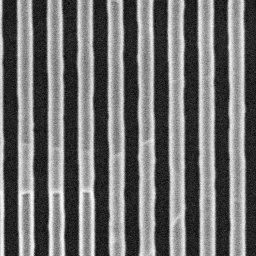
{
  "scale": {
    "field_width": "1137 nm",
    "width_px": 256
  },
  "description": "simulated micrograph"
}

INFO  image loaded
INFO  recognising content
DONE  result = wiring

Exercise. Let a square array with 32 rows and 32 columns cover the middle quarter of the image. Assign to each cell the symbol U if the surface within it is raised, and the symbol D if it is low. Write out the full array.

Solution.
DDDDUUUDDDDUUUUDDDDUUUDDDDUUUUDD
DDDDUUUDDDDUUUUDDDDUUUDDDDUUUUDD
DDDDUUUDDDDUUUUDDDDUUUDDDDUUUUDD
DDDDUUUDDDDUUUUDDDDUUUDDDDUUUUDD
DDDDUUUDDDDUUUUDDDDUUUDDDDUUUUDD
DDDDUUUDDDDUUUUDDDDUUUDDDDUUUUDD
DDDDUUUDDDDUUUUDDDDUUUDDDDUUUUDD
DDDDUUUDDDDUUUUDDDDUUUDDDDUUUUDD
DDDDUUUDDDDUUUUDDDDUUUDDDDUUUUDD
DDDDUUUDDDDUUUUDDDDUUUDDDDUUUUDD
DDDDUUUDDDDUUUUDDDDUUUDDDDUUUUDD
DDDDUUUDDDDUUUUDDDDUUUDDDDUUUUDD
DDDDUUUDDDDUUUUDDDDUUUDDDDUUUUDD
DDDDUUUDDDDUUUUDDDDUUUDDDDUUUUDD
DDDDUUUDDDDUUUUDDDDUUUDDDDUUUUDD
DDDDUUUDDDDUUUUDDDDUUUDDDDUUUUDD
DDDDUUUDDDDUUUUDDDDUUUDDDDUUUUDD
DDDDUUUDDDDUUUUDDDDUUUDDDDUUUUDD
DDDDUUUDDDDUUUUDDDDUUUDDDDUUUUDD
DDDDUUUDDDDUUUUDDDDUUUDDDDUUUUDD
DDDDUUUDDDDDUUUDDDDUUUDDDDUUUUDD
DDDDUUUDDDDDUUUDDDDUUUDDDDUUUUDD
DDDDUUUDDDDDUUUDDDDUUUDDDDUUUUDD
DDDDUUUDDDDDUUUDDDDUUUUDDDUUUUDD
DDDDUUUDDDDDUUUDDDDUUUUDDDUUUUDD
DDDDUUUDDDDDUUUDDDDUUUDDDDUUUUDD
DDDDUUUDDDDDUUUDDDDUUUDDDDDUUUDD
DDDDUUUDDDDDUUUDDDDUUUDDDDDUUUDD
DDDDUUUDDDDDUUUDDDDUUUDDDDDUUUDD
DDDDUUUDDDDDUUUDDDDUUUDDDDDUUUDD
DDDDUUUDDDDDUUUDDDDUUUUDDDDUUUDD
DDDDUUUDDDDDUUUDDDDUUUUDDDDUUUDD